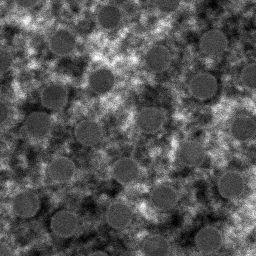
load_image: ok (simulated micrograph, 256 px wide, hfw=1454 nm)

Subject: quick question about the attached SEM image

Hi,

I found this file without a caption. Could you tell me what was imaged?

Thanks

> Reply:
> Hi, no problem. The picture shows a regular array of raised bodies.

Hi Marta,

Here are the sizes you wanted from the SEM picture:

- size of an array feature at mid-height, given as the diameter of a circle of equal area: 152 nm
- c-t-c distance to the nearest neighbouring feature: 259 nm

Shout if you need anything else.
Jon